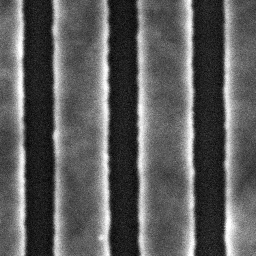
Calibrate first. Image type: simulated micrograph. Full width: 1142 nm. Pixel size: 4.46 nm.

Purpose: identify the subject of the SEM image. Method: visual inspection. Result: lines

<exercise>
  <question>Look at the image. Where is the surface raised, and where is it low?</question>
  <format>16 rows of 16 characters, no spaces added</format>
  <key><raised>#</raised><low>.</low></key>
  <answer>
#..####..###..##
#..####..###..##
#..####..###..##
#..####..###..##
#..####..###..##
#..####..###..##
#..####..###..##
#..####..###..##
#..####..###..##
#..####..###..##
#...###..###..##
#...###..###..##
#..####..###..##
#..####..###..##
##.####..###..##
##.####..###..##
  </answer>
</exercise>